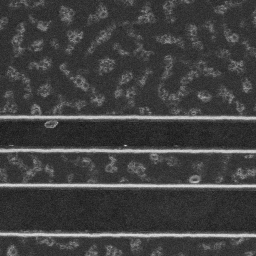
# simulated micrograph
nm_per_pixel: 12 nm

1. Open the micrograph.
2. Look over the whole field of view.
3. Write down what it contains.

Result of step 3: one or a few lines or trenches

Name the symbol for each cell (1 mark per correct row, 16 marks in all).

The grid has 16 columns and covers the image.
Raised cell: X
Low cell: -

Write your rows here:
XXXXXXXXXXXXXXXX
XXXXXXXXXXXXXXXX
XXXXXXXXXXXXXXXX
XXXXXXXXXXXXXXXX
XXXXXXXXXXXXXXXX
XXXXXXXXXXXXXXXX
XXXXXXXXXXXXXXXX
----------------
----------------
XXXXXXXXXXXXXXXX
XXXXXXXXXXXXXXXX
XXXXXXXXXXXXXXXX
----------------
----------------
----------------
XXXXXXXXXXXXXXXX